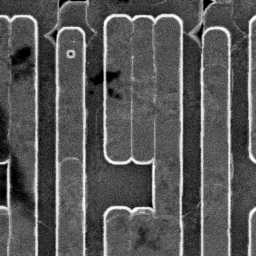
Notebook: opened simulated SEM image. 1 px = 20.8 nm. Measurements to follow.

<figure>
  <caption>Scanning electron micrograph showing wiring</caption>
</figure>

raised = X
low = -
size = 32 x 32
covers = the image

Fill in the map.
--------------------------------
--------------------------------
XXXX---------XXXXXXXXX----------
XXXX----XX---XXXXXXXXXX--------X
XXXX---XXXX--XXXXXXXXXX--XXXX--X
XXXX---XXXX--XXXXXXXXXX--XXXX--X
XXXX---XXXX--XXXXXXXXXX--XXXX--X
XXXXX--XXXX--XXXXXXXXXX--XXXX--X
XXXXX--XXXX--XXXXXXXXXX--XXXX--X
XXXXX--XXXX--XXXXXXXXXX--XXXX--X
XXXX---XXX---XXXXXXXXXX--XXXX--X
XXXXX--XXXX--XXXXXXXXXX--XXXX--X
XXXXX--XXXX--XXXXXXXXXX--XXXX--X
XXXXX--XXXX--XXXXXXXXXX--XXXX--X
XXXX---XXXX--XXXXXXXXXX--XXXX--X
XXXX---XXXX--XXXXXXXXXX--XXXX--X
XXXXX--XXXX--XXXXXXXXXX--XXXX--X
XXXXX--XXXX--XXXXXXXXXX--XXXX--X
XXXXX--XXXX--XXXXXXXXXX--XXXX--X
XXXXX--XXXX--XXXXXXXXXX--XXXX--X
-XXX---XXXX--------XXXX--XXXX---
-XXX---XXXX--------XXXX--XXXX---
-XXX---XXXX--------XXXX--XXXX---
-XXX---XXXX--------XXXX--XXXX---
-XXX---XXXX--------XXXX--XXXX---
-XXXX--XXXX--------XXXX--XXXX---
XXXXX--XXXX--XXXXXXXXXX--XXXX---
XXXX---XXXX--XXXXXXXXXX--XXXX--X
XXXX---XXXX--XXXXXXXXXX--XXXX--X
XXXXX--XXXX--XXXXXXXXXX--XXXX--X
XXXXX--XXXX--XXXXXXXXXX--XXXX--X
XXXXX--XXXX--XXXXXXXXXX--XXXX--X